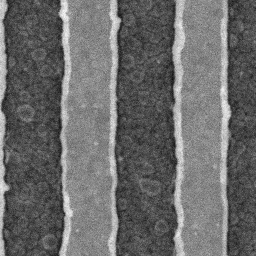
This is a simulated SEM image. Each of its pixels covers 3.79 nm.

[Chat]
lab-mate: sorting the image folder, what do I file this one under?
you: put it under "one or a few lines or trenches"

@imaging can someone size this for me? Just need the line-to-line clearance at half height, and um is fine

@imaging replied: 0.235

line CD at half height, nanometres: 189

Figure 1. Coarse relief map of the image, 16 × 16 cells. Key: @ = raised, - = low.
----@@@----@@@--
----@@@----@@@--
----@@@----@@@--
----@@@----@@@--
----@@@----@@@--
----@@@----@@@--
----@@@----@@@--
----@@@----@@@--
----@@@----@@@--
----@@@----@@@--
----@@@----@@@--
----@@@----@@@--
----@@@----@@@--
----@@@----@@@--
----@@@----@@@--
----@@@----@@@--